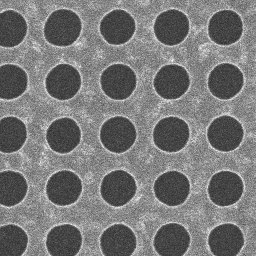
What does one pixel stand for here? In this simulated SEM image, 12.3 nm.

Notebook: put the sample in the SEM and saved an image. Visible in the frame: a regular array of holes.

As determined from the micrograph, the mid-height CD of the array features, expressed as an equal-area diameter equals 0.436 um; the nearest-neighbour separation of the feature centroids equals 0.653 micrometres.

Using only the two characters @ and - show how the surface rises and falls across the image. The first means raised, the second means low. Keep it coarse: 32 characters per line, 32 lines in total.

@@@@@@@@@@@@@@@@@@@@@@@@@@@@@@@@
--@@@@@--@@@@@--@@@@@--@@@@--@@@
---@@@----@@@----@@----@@@----@@
---@@@----@@@----@@-----@@----@@
---@@@----@@@---@@@----@@@----@@
--@@@@---@@@@@-@@@@@@-@@@@@--@@@
@@@@@@@@@@@@@@@@@@@@@@@@@@@@@@@@
@@@@@@@@@@@@@@@@@@@@@@@@@@@@@@@@
--@@@@@--@@@@---@@@@---@@@@---@@
---@@@----@@@----@@-----@@----@@
---@@@----@@@----@@-----@@----@@
---@@@----@@@----@@@---@@@----@@
@@@@@@@@@@@@@@@@@@@@@@@@@@@@@@@@
@@@@@@@@@@@@@@@@@@@@@@@@@@@@@@@@
@@@@@@@@@@@@@@@@@@@@@@@@@@@@@@@@
---@@@----@@@----@@@---@@@----@@
---@@@----@@@----@@-----@@----@@
---@@@----@@@----@@----@@@----@@
---@@@---@@@@---@@@@---@@@@--@@@
@@@@@@@@@@@@@@@@@@@@@@@@@@@@@@@@
@@@@@@@@@@@@@@@@@@@@@@@@@@@@@@@@
--@@@@@--@@@@@--@@@@@-@@@@@@-@@@
---@@@----@@@----@@@---@@@----@@
---@@@----@@@----@@-----@@----@@
---@@@----@@@----@@@---@@@----@@
--@@@@@--@@@@@--@@@@@--@@@@--@@@
@@@@@@@@@@@@@@@@@@@@@@@@@@@@@@@@
@@@@@@@@@@@@@@@@@@@@@@@@@@@@@@@@
---@@@@--@@@@@--@@@@---@@@@---@@
---@@@----@@@----@@-----@@----@@
---@@@----@@@----@@-----@@----@@
---@@@----@@@----@@@---@@@----@@